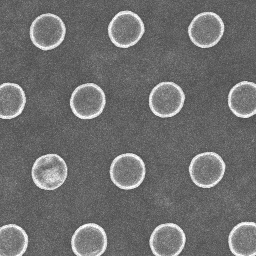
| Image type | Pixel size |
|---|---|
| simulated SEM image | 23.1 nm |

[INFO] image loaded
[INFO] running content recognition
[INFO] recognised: a regular array of raised bodies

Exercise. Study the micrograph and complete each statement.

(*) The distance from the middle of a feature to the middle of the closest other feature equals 1810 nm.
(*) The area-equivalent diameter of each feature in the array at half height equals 776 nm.